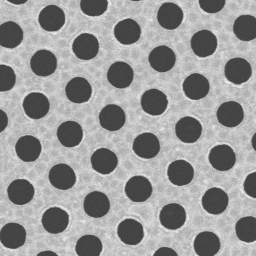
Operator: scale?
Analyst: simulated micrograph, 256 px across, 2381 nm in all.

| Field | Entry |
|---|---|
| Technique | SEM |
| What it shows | a regular array of holes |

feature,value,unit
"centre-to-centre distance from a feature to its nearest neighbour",0.406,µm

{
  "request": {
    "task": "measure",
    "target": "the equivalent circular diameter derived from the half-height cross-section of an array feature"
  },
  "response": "248 nm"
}